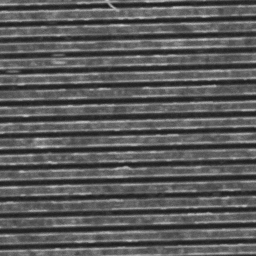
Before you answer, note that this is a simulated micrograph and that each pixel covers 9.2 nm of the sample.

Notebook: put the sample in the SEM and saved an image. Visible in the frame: parallel lines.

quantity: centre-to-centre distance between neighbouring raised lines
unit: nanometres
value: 146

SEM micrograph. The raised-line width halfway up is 79.3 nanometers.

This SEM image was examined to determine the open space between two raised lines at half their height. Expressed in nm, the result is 62.1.